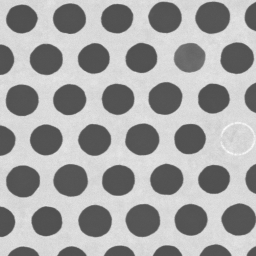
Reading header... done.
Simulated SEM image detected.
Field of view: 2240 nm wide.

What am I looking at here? a regular array of holes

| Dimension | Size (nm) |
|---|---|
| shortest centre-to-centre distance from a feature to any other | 408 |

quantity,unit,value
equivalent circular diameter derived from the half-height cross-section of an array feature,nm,281